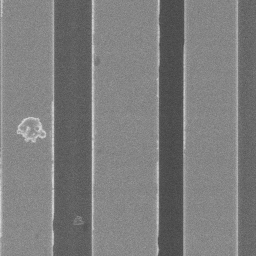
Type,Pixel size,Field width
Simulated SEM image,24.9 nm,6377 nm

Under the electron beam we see lines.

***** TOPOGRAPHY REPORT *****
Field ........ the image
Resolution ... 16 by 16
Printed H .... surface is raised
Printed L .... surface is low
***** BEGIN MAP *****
HHHLLLHHHHLLHHHL
HHHLLLHHHHLLHHHL
HHHLLLHHHHLLHHHL
HHHLLLHHHHLLHHHL
HHHLLLHHHHLLHHHL
HHHLLLHHHHLLHHHL
HHHLLLHHHHLLHHHL
HHHLLLHHHHLLHHHL
HHHLLLHHHHLLHHHL
HHHLLLHHHHLLHHHL
HHHLLLHHHHLLHHHL
HHHLLLHHHHLLHHHL
HHHLLLHHHHLLHHHL
HHHLLLHHHHLLHHHL
HHHLLLHHHHLLHHHL
HHHLLLHHHHLLHHHL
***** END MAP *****